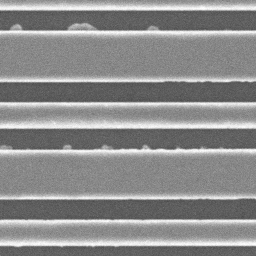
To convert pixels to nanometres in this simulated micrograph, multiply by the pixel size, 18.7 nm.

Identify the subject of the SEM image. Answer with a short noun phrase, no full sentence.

lines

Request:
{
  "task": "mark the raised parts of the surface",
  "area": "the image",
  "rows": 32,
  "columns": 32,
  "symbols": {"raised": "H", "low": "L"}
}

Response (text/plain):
HHHHHHHHHHHHHHHHHHHHHHHHHHHHHHHH
LLLLLLLLLLLLLLLLLLLLLLLLLLLLLLLL
LLLLLLLLLLLLLLLLLLLLLLLLLLLLLLLL
LLLLLLLLLLLLLLLLLLLLLLLLLLLLLLLL
HHHHHHHHHHHHHHHHHHHHHHHHHHHHHHHH
HHHHHHHHHHHHHHHHHHHHHHHHHHHHHHHH
HHHHHHHHHHHHHHHHHHHHHHHHHHHHHHHH
HHHHHHHHHHHHHHHHHHHHHHHHHHHHHHHH
HHHHHHHHHHHHHHHHHHHHHHHHHHHHHHHH
HHHHHHHHHHHHHHHHHHHHHHHHHHHHHHHH
LLLLLLLLLLLLLLLLLLLLLLLLLLLLLLLL
LLLLLLLLLLLLLLLLLLLLLLLLLLLLLLLL
LLLLLLLLLLLLLLLLLLLLLLLLLLLLLLLL
HHHHHHHHHHHHHHHHHHHHHHHHHHHHHHHH
HHHHHHHHHHHHHHHHHHHHHHHHHHHHHHHH
HHHHHHHHHHHHHHHHHHHHHHHHHHHHHHHH
LLLLLLLLLLLLLLLLLLLLLLLLLLLLLLLL
LLLLLLLLLLLLLLLLLLLLLLLLLLLLLLLL
LLLLLLLLLLLLLLLLLLLLLLLLLLLLLLLL
HHHHHHHHHHHHHHHHHHHHHHHHHHHHHHHH
HHHHHHHHHHHHHHHHHHHHHHHHHHHHHHHH
HHHHHHHHHHHHHHHHHHHHHHHHHHHHHHHH
HHHHHHHHHHHHHHHHHHHHHHHHHHHHHHHH
HHHHHHHHHHHHHHHHHHHHHHHHHHHHHHHH
HHHHHHHHHHHHHHHHHHHHHHHHHHHHHHHH
LLLLLLLLLLLLLLLLLLLLLLLLLLLLLLLL
LLLLLLLLLLLLLLLLLLLLLLLLLLLLLLLL
LLLLLLLLLLLLLLLLLLLLLLLLLLLLLLLL
HHHHHHHHHHHHHHHHHHHHHHHHHHHHHHHH
HHHHHHHHHHHHHHHHHHHHHHHHHHHHHHHH
HHHHHHHHHHHHHHHHHHHHHHHHHHHHHHHH
LLLLLLLLLLLLLLLLLLLLLLLLLLLLLLLL